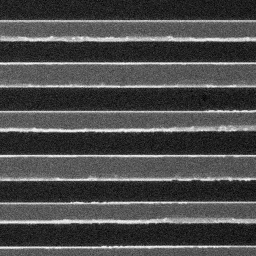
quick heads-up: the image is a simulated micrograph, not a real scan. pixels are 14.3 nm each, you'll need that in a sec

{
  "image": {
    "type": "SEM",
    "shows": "lines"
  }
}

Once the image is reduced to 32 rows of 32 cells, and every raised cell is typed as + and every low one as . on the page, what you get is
................................
................................
................................
++++++++++++++++++++++++++++++++
++++++++++++++++++++++++++++++++
................................
................................
................................
++++++++++++++++++++++++++++++++
++++++++++++++++++++++++++++++++
++++++++++++++++++++++++++++++++
................................
................................
................................
++++++++++++++++++++++++++++++++
++++++++++++++++++++++++++++++++
................................
................................
................................
++++++++++++++++++++++++++++++++
++++++++++++++++++++++++++++++++
++++++++++++++++++++++++++++++++
++++.++++++++.++................
................................
................................
++++++++++++++++++++++++++++++++
++++++++++++++++++++++++++++++++
++++++++++++++++++++++++++++++++
................................
................................
................................
++++++++++++++++++++++++++++++++